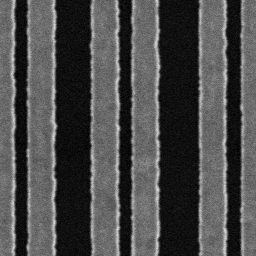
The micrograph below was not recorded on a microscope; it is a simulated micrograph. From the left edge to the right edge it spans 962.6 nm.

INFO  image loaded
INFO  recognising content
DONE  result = lines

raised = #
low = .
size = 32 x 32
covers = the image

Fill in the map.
##..###....####..###.....###..##
##..###....####..###.....###..##
##..###....####..###.....###..##
##.####....####..###.....###..##
##..###.....###..###.....###..##
##..###....####..###.....###..##
##..###....####..###.....###..##
##..###....####..###.....###..##
##..###....####..###.....###..##
##..###.....###..###.....###..##
##..###....####..###.....###..##
##.####....####..###.....###..##
##.####....####..###.....###..##
##.####....####..###.....###..##
##..###....####..###.....###..##
##..###....####..###.....###..##
##..###....####..###.....###..##
##..###....####..###.....###..##
##.####....####..###.....###..##
##..###....####..###.....###..##
##..###....####..###.....###..##
##..###....####..###.....###..##
##..###....####..###.....###..##
##..###....####..###.....###..##
##..###.....###..###.....###..##
##..###....####..###.....###..##
##..###....####..###.....###..##
##..###....####..###.....###..##
##..###....####..###.....###..##
##..###....####..###.....###..##
##.####.....###..###.....###..##
##.####.....###..###.....###..##